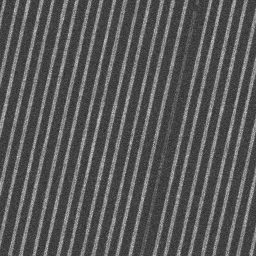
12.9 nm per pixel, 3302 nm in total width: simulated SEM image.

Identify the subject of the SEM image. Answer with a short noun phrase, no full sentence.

parallel lines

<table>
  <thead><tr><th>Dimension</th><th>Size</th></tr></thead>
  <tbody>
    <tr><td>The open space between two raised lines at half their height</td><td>123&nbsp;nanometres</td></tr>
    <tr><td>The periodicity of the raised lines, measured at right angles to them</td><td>152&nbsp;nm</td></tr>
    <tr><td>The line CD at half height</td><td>31.5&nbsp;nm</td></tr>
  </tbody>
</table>